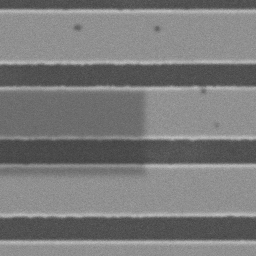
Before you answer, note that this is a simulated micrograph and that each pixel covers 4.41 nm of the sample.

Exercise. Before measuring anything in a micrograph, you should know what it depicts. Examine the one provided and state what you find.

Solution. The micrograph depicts lines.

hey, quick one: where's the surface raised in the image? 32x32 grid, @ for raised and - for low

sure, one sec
--------------------------------
@@@@@@@@@@@@@@@@@@@@@@@@@@@@@@@@
@@@@@@@@@@@@@@@@@@@@@@@@@@@@@@@@
@@@@@@@@@@@@@@@@@@@@@@@@@@@@@@@@
@@@@@@@@@@@@@@@@@@@@@@@@@@@@@@@@
@@@@@@@@@@@@@@@@@@@@@@@@@@@@@@@@
@@@@@@@@@@@@@@@@@@@@@@@@@@@@@@@@
@@@@@@@@@@@@@@@@@@@@@@@@@@@@@@@@
--------------------------------
--------------------------------
--------------------------------
@@@@@@@@@@@@@@@@@@@@@@@@@@@@@@@@
@@@@@@@@@@@@@@@@@@@@@@@@@@@@@@@@
@@@@@@@@@@@@@@@@@@@@@@@@@@@@@@@@
@@@@@@@@@@@@@@@@@@@@@@@@@@@@@@@@
@@@@@@@@@@@@@@@@@@@@@@@@@@@@@@@@
@@@@@@@@@@@@@@@@@@@@@@@@@@@@@@@@
--------------------------------
--------------------------------
--------------------------------
--------------------------------
@@@@@@@@@@@@@@@@@@@@@@@@@@@@@@@@
@@@@@@@@@@@@@@@@@@@@@@@@@@@@@@@@
@@@@@@@@@@@@@@@@@@@@@@@@@@@@@@@@
@@@@@@@@@@@@@@@@@@@@@@@@@@@@@@@@
@@@@@@@@@@@@@@@@@@@@@@@@@@@@@@@@
@@@@@@@@@@@@@@@@@@@@@@@@@@@@@@@@
--------------------------------
--------------------------------
--------------------------------
@@@@@@@@@@@@@@@@@@@@@@@@@@@@@@@@
@@@@@@@@@@@@@@@@@@@@@@@@@@@@@@@@